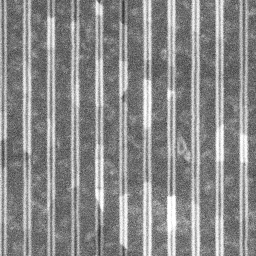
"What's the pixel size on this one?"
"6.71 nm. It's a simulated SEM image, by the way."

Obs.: parallel lines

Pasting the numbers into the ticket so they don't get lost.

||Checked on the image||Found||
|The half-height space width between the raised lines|132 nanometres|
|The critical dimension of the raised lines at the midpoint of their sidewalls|32.7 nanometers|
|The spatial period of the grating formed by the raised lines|161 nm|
